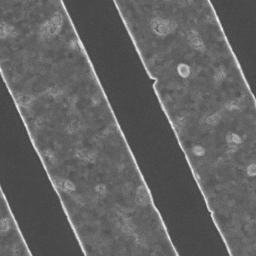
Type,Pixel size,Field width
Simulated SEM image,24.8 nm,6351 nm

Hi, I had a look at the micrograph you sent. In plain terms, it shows one or a few lines or trenches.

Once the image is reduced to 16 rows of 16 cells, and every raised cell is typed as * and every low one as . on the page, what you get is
****...******...
*****...******..
*****...******..
*****....******.
******...******.
******....******
.******...******
.******....*****
..******...*****
..******...*****
...******...****
...******...****
....******...***
*...******...***
*....*****....**
**...******...**